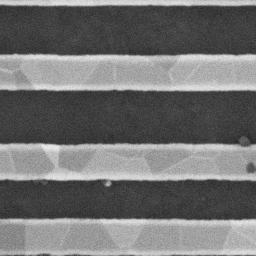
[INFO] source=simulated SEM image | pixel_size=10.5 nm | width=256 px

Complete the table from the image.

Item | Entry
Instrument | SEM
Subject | lines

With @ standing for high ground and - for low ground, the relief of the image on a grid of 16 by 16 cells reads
----------------
----------------
----------------
----------------
@@@@@@@@@@@@@@@@
@@@@@@@@@@@@@@@@
----------------
----------------
----------------
@@@@@@@@@@@@@@@@
@@@@@@@@@@@@@@@@
----------------
----------------
----------------
@@@@@@@@@@@@@@@@
@@@@@@@@@@@@@@@@